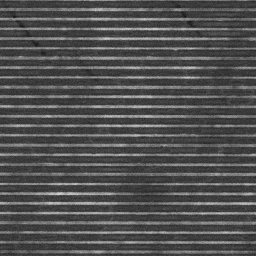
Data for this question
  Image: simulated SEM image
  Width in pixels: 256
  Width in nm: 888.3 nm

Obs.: parallel lines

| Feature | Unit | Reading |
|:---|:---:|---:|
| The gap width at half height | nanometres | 26.4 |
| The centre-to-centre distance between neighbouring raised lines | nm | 33.6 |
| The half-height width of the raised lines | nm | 6.1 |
